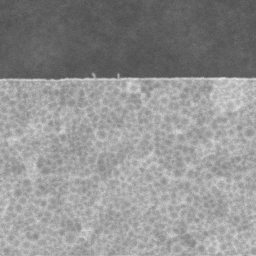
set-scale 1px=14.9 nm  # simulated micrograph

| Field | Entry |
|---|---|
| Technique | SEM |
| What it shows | one or a few lines or trenches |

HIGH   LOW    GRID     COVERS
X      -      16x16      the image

----------------
----------------
----------------
----------------
----------------
XXXXXXXXXXXXXXXX
XXXXXXXXXXXXXXXX
XXXXXXXXXXXXXXXX
XXXXXXXXXXXXXXXX
XXXXXXXXXXXXXXXX
XXXXXXXXXXXXXXXX
XXXXXXXXXXXXXXXX
XXXXXXXXXXXXXXXX
XXXXXXXXXXXXXXXX
XXXXXXXXXXXXXXXX
XXXXXXXXXXXXXXXX